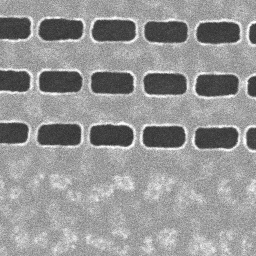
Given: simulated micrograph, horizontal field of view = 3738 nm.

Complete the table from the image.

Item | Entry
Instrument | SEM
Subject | a regular array of holes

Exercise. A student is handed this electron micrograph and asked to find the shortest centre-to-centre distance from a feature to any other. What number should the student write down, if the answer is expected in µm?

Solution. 0.757